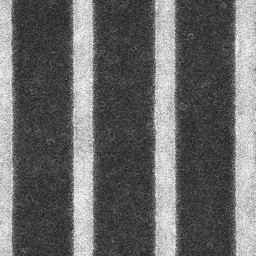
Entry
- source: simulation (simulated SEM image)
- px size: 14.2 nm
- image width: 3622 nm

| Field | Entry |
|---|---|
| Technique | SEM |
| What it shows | one or a few lines or trenches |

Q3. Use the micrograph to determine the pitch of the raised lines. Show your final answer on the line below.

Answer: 1.15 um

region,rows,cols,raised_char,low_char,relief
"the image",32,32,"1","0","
01111111100111111111001111111100
01111111100111111111001111111100
01111111100111111110001111111100
01111111100011111110001111111100
01111111100011111111001111111100
01111111100011111111001111111100
01111111100111111111001111111100
01111111100011111111001111111100
01111111100011111111001111111100
01111111100011111111001111111100
01111111100011111110001111111100
01111111100011111111001111111100
01111111100111111111001111111100
01111111100111111110001111111100
01111111100111111110001111111100
01111111100111111110001111111100
01111111100111111111001111111100
01111111100011111111001111111100
01111111100011111111001111111100
01111111100011111111001111111100
01111111100011111110001111111100
01111111100011111110001111111000
01111111100011111111001111111100
00111111100011111111001111111100
01111111100111111111001111111100
01111111100111111111001111111100
01111111100011111111001111111000
01111111100011111111001111111100
01111111100011111111001111111100
01111111100011111111001111111100
01111111100011111111001111111100
01111111100011111110001111111100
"